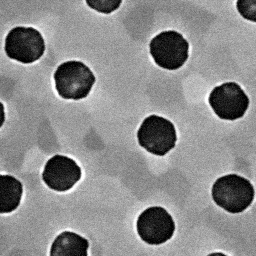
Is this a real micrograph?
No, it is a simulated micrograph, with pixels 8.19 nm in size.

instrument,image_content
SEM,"holes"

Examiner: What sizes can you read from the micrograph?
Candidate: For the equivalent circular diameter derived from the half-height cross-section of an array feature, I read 39.9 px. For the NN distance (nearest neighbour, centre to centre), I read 642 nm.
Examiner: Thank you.